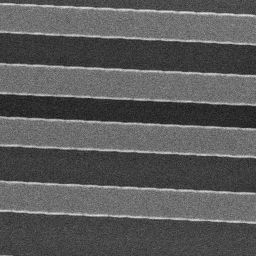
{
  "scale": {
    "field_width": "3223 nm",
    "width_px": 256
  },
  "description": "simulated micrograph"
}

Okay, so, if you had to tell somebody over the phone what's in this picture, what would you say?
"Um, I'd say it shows lines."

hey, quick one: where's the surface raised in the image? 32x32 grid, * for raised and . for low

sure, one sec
**..............................
**********************..........
********************************
********************************
...........*********************
.............................***
................................
................................
***********.....................
********************************
********************************
********************************
................****************
................................
................................
******************..............
********************************
********************************
.......*************************
...........................*****
................................
................................
................................
*****************...............
********************************
********************************
..******************************
.......................*********
................................
................................
................................
................................